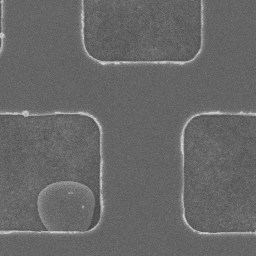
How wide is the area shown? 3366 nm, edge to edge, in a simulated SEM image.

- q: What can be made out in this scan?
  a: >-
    holes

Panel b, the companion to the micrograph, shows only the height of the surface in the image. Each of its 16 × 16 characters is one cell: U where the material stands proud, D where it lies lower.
UUUUUDDDDDDDDUUU
UUUUUDDDDDDDDUUU
UUUUUDDDDDDDDUUU
UUUUUUDDDDDDUUUU
UUUUUUUUUUUUUUUU
UUUUUUUUUUUUUUUU
UUUUUUUUUUUUUUUU
DDDDDDUUUUUUDDDD
DDDDDDUUUUUUDDDD
DDDDDDUUUUUDDDDD
DDDDDDUUUUUDDDDD
DDDDDDUUUUUUDDDD
DDDDDDUUUUUDDDDD
DDDDDDUUUUUUDDDD
UUUUUUUUUUUUUDDU
UUUUUUUUUUUUUUUU